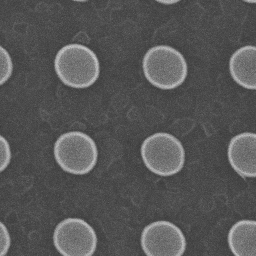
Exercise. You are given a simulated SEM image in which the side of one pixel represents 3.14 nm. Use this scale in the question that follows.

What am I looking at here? raised bodies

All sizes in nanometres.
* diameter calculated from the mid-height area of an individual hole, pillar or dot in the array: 129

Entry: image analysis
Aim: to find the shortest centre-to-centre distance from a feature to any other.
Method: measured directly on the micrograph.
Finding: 273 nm